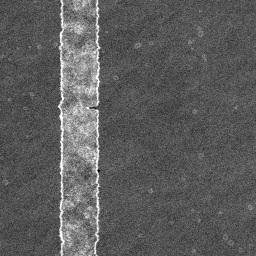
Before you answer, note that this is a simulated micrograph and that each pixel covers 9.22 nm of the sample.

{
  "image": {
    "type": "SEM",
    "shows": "one or a few lines or trenches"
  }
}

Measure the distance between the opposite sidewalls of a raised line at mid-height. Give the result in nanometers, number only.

332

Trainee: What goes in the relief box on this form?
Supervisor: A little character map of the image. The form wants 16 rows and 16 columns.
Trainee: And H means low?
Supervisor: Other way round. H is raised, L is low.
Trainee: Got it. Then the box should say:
LLLLHHLLLLLLLLLL
LLLLHHLLLLLLLLLL
LLLLHHLLLLLLLLLL
LLLLHHLLLLLLLLLL
LLLLHHLLLLLLLLLL
LLLLHHLLLLLLLLLL
LLLLHHLLLLLLLLLL
LLLLHHLLLLLLLLLL
LLLLHHLLLLLLLLLL
LLLLHHLLLLLLLLLL
LLLLHHLLLLLLLLLL
LLLLHHLLLLLLLLLL
LLLLHHLLLLLLLLLL
LLLLHHLLLLLLLLLL
LLLLHHLLLLLLLLLL
LLLLHHLLLLLLLLLL